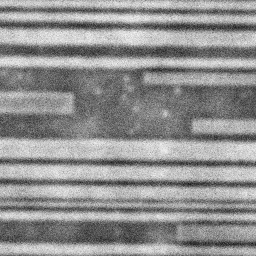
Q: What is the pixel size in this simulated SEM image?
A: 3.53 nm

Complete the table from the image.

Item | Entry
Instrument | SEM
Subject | groups of lines, slits or small figures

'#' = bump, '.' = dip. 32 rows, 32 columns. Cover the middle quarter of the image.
..##############################
................................
....................############
....................############
....................############
................................
................................
................................
##..............................
##..............................
##..............................
##..............................
................................
................................
................................
................................
................................
................................
................................
###....#####....................
################################
################################
################################
################################
................................
#...............................
################################
################################
################################
................................
................................
################################